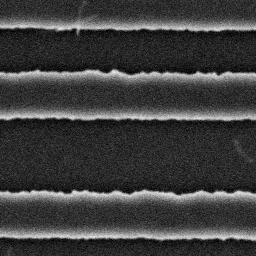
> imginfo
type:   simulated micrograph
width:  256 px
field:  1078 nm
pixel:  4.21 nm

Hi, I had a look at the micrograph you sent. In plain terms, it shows lines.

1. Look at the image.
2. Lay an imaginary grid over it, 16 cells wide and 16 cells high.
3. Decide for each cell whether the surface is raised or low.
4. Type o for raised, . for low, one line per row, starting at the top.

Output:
oooooooooooooooo
oooooooooooooooo
................
................
..o..o..........
oooooooooooooooo
oooooooooooooooo
..............o.
................
................
................
................
oooooooooooooooo
oooooooooooooooo
oooooooooooooooo
................